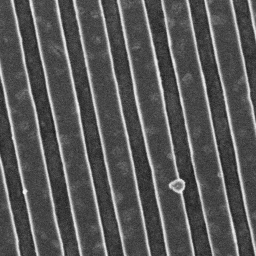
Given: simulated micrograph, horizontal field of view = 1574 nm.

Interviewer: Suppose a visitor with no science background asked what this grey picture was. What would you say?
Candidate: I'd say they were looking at parallel lines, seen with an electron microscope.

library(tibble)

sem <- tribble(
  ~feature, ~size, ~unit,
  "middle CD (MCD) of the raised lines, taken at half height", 165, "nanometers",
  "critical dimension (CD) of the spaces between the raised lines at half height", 100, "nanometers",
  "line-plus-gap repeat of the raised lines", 264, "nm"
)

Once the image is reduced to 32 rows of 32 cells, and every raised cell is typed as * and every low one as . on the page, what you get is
**..***..****..***..****..***..*
**..***...***..***..****..***..*
**..****..***..****..***..***...
**..****..***..****..***..****..
***..***..****..***..***..****..
***..***..****..***..****..***..
***..***..****..***..****..***..
***..****..***..***..****..***..
***..****..***..****..***..****.
****..***..***..****..***..****.
****..***..****..***..****..***.
****..***..****..***..****..***.
.***..****..***..***...***..***.
.***..****..***..****..***..****
.****..***..***..****..***..****
.****..***..****..***..****..***
.****..***..****..***..****..***
..***..****..***..***...***..***
..***..****..***..****..***..***
..****..***..****.****..***..***
..****..***..****..***..****..**
..****..***..****..***..****..**
*..***..****..***..****.****..**
*..***..****..***..****..***..**
*..****..***..***..****..***..**
*..****..***..****..***..****..*
*..****..***..****..***..****..*
**..***..****..***..***...***..*
**..***..****..***..****..***..*
**..***...***..***...***..***..*
**..****..***..****..***..****..
**..****..***..****..***..****..